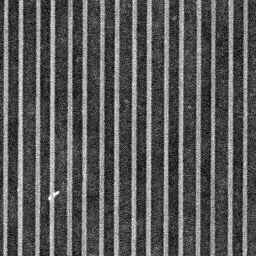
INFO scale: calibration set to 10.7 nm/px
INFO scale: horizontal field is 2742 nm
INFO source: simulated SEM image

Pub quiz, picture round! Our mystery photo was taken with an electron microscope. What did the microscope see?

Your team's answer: parallel lines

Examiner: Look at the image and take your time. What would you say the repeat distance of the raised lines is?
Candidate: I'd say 171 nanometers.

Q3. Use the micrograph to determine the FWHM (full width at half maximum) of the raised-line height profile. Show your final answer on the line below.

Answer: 29.5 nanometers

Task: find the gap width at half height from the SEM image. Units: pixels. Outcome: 12